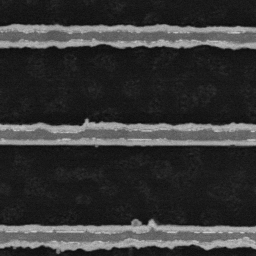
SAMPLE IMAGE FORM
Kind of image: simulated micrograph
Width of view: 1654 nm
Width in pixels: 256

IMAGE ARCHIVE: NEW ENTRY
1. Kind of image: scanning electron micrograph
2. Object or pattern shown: one or a few lines or trenches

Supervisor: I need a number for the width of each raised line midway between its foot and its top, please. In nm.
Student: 106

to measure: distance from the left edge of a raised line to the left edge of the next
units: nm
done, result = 646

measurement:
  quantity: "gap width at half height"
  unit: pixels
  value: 84.3